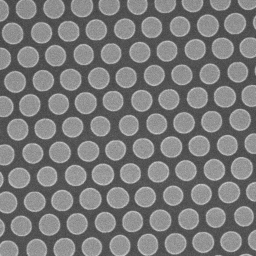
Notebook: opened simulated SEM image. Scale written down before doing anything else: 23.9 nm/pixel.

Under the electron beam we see an array of small figures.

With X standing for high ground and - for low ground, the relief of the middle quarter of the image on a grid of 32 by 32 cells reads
----------------------X-----XXX-
-X-----XXX----XXX---XXXXX--XXXXX
XXXX--XXXXX--XXXXX--XXXXX--XXXXX
XXXX--XXXXX--XXXXX--XXXXX--XXXXX
XXXX--XXXXX--XXXXX---XXX----XXX-
XXXX---XXXX---XXX---------------
-XX-----------------------------
----XXX---XXXX---XXXX---XXXX---X
X--XXXXX--XXXXX--XXXXX--XXXXX--X
X--XXXXX--XXXXX--XXXXX--XXXXX--X
X--XXXXX--XXXX---XXXXX--XXXX----
X--XXXX----XX-----XXX-----------
-----------------------------XX-
-XX-----XX-----XXX---XXXX---XXXX
XXXX---XXXX---XXXX---XXXXX-XXXXX
XXXXX--XXXX---XXXXX--XXXXX--XXXX
XXXXX--XXXX---XXXX---XXXX---XXXX
XXXX----XXX----XXX-----X--------
--------------------------XX----
-----XX-----XX----XXXX---XXXX--X
X---XXXX---XXXX--XXXXX--XXXXX--X
X---XXXXX-XXXXX--XXXXX--XXXXX--X
XX--XXXXX--XXXX---XXXX---XXXX---
X---XXXX---XXX-----XX-----------
-----------------------X-----XXX
--XX----XXX----XXX---XXXXX--XXXX
-XXXX--XXXXX--XXXXX--XXXXX--XXXX
XXXXX--XXXXX--XXXXX--XXXXX--XXXX
XXXXX--XXXXX--XXXXX--XXXXX---XXX
-XXXX---XXXX---XXX--------------
--------------------------------
-----XXX----XXX----XXX---XXXX---